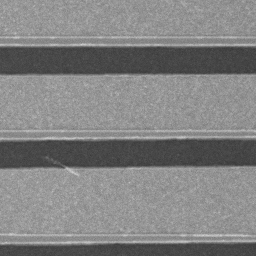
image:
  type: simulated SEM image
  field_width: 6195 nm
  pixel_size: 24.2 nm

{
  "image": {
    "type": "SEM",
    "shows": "lines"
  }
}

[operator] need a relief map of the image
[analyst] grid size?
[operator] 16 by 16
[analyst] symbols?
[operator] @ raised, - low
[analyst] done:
@@@@@@@@@@@@@@@@
@@@@@@@@@@@@@@@@
@@@@@@@@@@@@@@@@
----------------
----------------
@@@@@@@@@@@@@@@@
@@@@@@@@@@@@@@@@
@@@@@@@@@@@@@@@@
@@@@@@@@@@@@@@@@
----------------
--------------@@
@@@@@@@@@@@@@@@@
@@@@@@@@@@@@@@@@
@@@@@@@@@@@@@@@@
@@@@@@@@@@@@@@@@
----------------